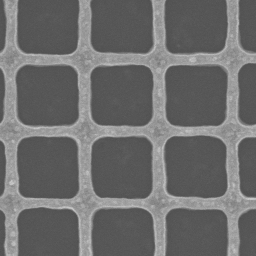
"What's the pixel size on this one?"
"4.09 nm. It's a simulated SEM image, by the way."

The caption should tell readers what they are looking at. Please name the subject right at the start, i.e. holes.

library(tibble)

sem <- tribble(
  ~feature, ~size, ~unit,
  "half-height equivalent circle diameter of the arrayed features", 280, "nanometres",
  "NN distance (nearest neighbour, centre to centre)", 71.7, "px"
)